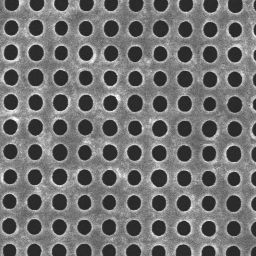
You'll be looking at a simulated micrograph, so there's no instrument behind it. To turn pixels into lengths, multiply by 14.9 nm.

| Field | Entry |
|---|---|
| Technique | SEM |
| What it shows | a regular array of holes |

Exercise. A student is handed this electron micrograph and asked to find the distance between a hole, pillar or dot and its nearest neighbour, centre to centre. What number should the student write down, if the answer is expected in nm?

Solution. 367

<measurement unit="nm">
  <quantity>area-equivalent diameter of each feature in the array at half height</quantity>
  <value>227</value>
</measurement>